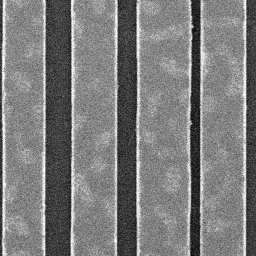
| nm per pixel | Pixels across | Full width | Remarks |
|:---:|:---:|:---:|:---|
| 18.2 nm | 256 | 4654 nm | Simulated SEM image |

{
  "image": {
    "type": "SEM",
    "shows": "one or a few lines or trenches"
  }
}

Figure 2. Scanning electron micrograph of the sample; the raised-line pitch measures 1210 nm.